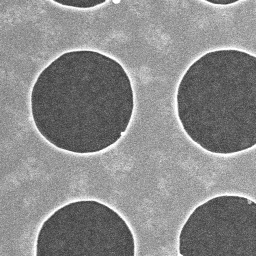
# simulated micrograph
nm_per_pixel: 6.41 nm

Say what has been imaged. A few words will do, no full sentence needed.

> holes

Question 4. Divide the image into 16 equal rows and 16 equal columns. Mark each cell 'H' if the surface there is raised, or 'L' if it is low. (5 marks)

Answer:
HHHHHHHHHHHHHHHH
HHHHHHHHHHHHHHHH
HHHHHHHHHHHHHHHH
HHHHLLLHHHHHHLLL
HHHLLLLLHHHHLLLL
HHLLLLLLHHHLLLLL
HHLLLLLLHHHLLLLL
HHLLLLLLHHHLLLLL
HHHLLLLLHHHHLLLL
HHHHHLHHHHHHHLLH
HHHHHHHHHHHHHHHH
HHHHHHHHHHHHHHHH
HHHHHHHHHHHHHLLL
HHHLLLLLHHHHLLLL
HHLLLLLLHHHLLLLL
HHLLLLLLHHHLLLLL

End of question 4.